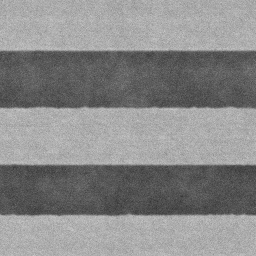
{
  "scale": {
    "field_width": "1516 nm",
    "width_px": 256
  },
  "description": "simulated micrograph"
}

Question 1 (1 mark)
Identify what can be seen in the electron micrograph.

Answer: lines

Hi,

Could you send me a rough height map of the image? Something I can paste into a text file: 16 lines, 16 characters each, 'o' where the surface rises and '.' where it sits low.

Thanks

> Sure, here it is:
oooooooooooooooo
oooooooooooooooo
oooooooooooooooo
................
................
................
................
oooooooooooooooo
oooooooooooooooo
oooooooooooooooo
................
................
................
oooooooooooooooo
oooooooooooooooo
oooooooooooooooo